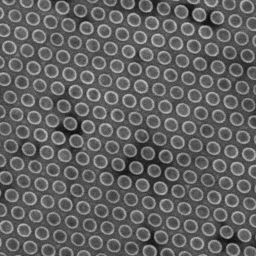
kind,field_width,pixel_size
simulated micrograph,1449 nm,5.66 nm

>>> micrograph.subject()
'a regular array of raised bodies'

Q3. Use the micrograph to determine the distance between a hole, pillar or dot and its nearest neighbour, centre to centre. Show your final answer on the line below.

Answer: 102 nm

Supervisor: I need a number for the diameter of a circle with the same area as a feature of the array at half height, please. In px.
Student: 12.8